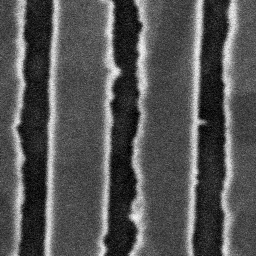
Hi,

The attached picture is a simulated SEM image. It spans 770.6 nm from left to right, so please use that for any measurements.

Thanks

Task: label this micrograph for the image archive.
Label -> one or a few lines or trenches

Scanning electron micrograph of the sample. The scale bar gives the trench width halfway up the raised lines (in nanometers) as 91.8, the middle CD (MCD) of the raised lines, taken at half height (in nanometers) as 173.